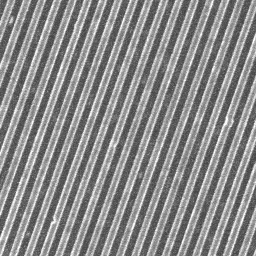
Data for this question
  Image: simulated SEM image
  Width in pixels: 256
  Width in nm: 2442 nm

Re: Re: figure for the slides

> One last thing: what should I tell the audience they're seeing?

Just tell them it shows parallel lines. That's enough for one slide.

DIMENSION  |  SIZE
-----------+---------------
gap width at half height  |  0.0753 µm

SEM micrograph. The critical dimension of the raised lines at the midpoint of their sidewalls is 56.2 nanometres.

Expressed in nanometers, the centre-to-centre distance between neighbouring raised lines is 137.